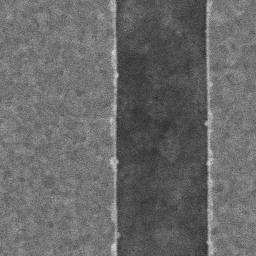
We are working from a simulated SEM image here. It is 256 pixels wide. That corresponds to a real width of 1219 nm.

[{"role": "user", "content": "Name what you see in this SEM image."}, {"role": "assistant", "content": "one or a few lines or trenches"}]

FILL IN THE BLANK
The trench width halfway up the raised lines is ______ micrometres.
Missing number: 0.44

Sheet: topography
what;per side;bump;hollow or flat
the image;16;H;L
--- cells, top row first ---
HHHHHHHLLLLLLHHH
HHHHHHHLLLLLLHHH
HHHHHHHLLLLLLHHH
HHHHHHHLLLLLLHHH
HHHHHHHLLLLLLHHH
HHHHHHHLLLLLLHHH
HHHHHHHLLLLLLHHH
HHHHHHHLLLLLLHHH
HHHHHHHLLLLLLHHH
HHHHHHHLLLLLLHHH
HHHHHHHLLLLLLHHH
HHHHHHHLLLLLLHHH
HHHHHHHLLLLLLHHH
HHHHHHHLLLLLLHHH
HHHHHHHLLLLLLHHH
HHHHHHHLLLLLLHHH